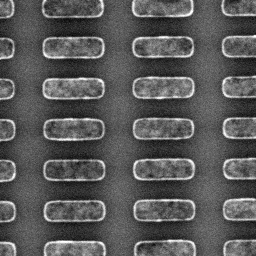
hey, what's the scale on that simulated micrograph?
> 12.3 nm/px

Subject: groups of lines, slits or small figures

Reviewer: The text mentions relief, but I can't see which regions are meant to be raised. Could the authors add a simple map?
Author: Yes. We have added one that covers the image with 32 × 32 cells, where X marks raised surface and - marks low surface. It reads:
XX---XXXXXXXX----XXXXXXX----XXXX
XX---XXXXXXXX----XXXXXXX----XXXX
--------------------------------
--------------------------------
--------------------------------
XX---XXXXXXXX----XXXXXXX----XXXX
XX---XXXXXXXX----XXXXXXX----XXXX
--------------------------------
--------------------------------
--------------------------------
XX---XXXXXXXX----XXXXXXX----XXXX
XX---XXXXXXXX----XXXXXXX----XXXX
--------------------------------
--------------------------------
--------------------------------
XX----XXXXXXX----XXXXXXX----XXXX
XX----XXXXXXX----XXXXXXX----XXXX
X-------------------------------
--------------------------------
--------------------------------
XX----XXXXXXX----XXXXXXX----XXXX
XX----XXXXXXX----XXXXXXX----XXXX
X-------------------------------
--------------------------------
--------------------------------
XX----XXXXXXX----XXXXXXX----XXXX
XX----XXXXXXX----XXXXXXX----XXXX
X-----XXXXXX-----XXXX-----------
--------------------------------
--------------------------------
X-----XXXXXXX----XXXXXXX----XXXX
XX----XXXXXXX----XXXXXXX----XXXX